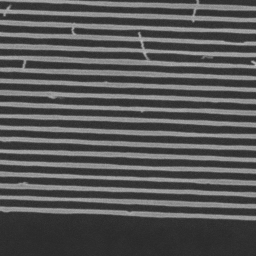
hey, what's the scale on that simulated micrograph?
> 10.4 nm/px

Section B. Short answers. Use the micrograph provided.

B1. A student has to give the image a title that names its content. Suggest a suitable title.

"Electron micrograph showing parallel lines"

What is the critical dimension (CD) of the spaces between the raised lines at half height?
79.3 nm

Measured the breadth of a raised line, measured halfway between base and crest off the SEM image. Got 40.3 nanometers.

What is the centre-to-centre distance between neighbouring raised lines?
121 nanometres